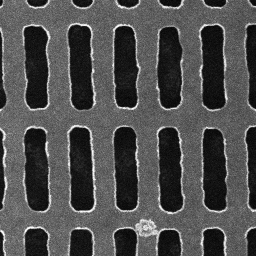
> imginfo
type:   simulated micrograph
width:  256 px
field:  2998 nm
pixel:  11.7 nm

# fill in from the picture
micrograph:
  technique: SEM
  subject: a regular array of holes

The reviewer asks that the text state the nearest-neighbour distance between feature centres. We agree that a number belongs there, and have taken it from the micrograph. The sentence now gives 519 nm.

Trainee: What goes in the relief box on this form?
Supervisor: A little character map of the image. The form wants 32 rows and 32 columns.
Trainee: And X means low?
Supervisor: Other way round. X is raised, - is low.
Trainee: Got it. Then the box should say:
XXXX--XXX--XXXX--XXX---XXX--XXX-
XXXXXXXXXXXXXXXXXXXXXXXXXXXXXXXX
XXXXXXXXXXXXXXXXXXXXXXXXXXXXXXXX
XXX--XXXX--XXXX-XXXX--XXX---XXX-
XXX---XXX--XXX---XXX--XXX---XXX-
XXX---XXX--XXX---XXX---XX---XXX-
XXX---XXX--XXX---XXX---XX---XXX-
XXX---XXX--XXX---XXX---XX---XXX-
XXX---XXX--XXX---XXX---XX---XXX-
XXX---XXX--XXX---XXX---XX---XXX-
XXX---XXX---XX---XXX---XX---XXX-
-XX---XXX---XX---XXX---XX---XXX-
-XX---XXX---XX---XXX---XX---XXX-
XXXX-XXXX--XXXXXXXXXX-XXXX--XXXX
XXXXXXXXXXXXXXXXXXXXXXXXXXXXXXXX
XXXXXXXXXXXXXXXXXXXXXXXXXXXXXXXX
XXX---XXX--XXX---XXX--XXXX--XXX-
XXX---XXX--XXX---XXX--XXX---XXX-
XXX---XXX--XXX---XXX---XX---XXX-
XXX---XXX---XX---XXX---XX---XXX-
XXX---XXX---XX---XXX---XX---XXX-
-XX---XXX---XX---XXX---XX---XXX-
-XX---XXX---XX---XXX---XX---XXX-
-XX---XXX---XX---XXX---XX---XXX-
XXX---XXX---XX---XXX---XXX--XXX-
XXXX--XXX---XXX--XXX---XXX--XXX-
XXXXXXXXXXXXXXXXXXXXX-XXXXXXXXXX
XXXXXXXXXXXXXXXXXXXXXXXXXXXXXXXX
XXXX-XXXXXXXXXXXXXXXXXXXXXXXXXXX
XXX---XXX--XXX---XXX--XXX---XXX-
XXX---XXX---XX---XXX---XX---XXX-
XXX---XXX---XX---XXX---XX---XXX-